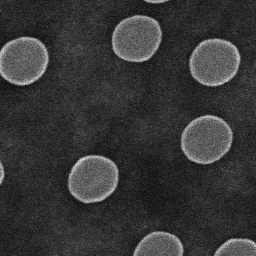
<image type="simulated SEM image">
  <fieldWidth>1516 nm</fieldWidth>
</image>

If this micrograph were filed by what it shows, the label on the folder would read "raised bodies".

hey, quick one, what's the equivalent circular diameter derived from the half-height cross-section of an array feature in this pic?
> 284 nanometers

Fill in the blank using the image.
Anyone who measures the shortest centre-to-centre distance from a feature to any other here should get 471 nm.